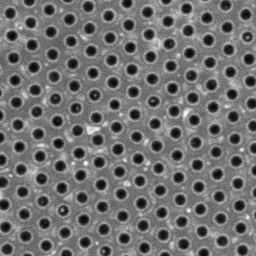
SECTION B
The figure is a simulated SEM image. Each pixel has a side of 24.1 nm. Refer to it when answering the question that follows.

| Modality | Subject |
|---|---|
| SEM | a regular array of raised bodies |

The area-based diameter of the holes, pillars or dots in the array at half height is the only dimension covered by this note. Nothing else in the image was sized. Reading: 0.337 um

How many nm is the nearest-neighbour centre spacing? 534